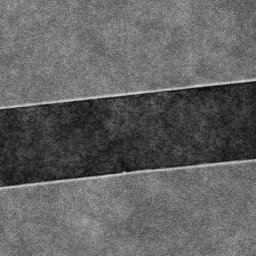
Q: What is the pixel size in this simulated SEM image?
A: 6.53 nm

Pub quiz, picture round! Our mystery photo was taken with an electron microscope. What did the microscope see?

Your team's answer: one or a few lines or trenches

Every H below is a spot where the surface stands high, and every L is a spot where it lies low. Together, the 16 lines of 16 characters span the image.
HHHHHHHHHHHHHHHH
HHHHHHHHHHHHHHHH
HHHHHHHHHHHHHHHH
HHHHHHHHHHHHHHHH
HHHHHHHHHHHHHHHH
HHHHHHHHHHHHLLLL
HHHLLLLLLLLLLLLL
LLLLLLLLLLLLLLLL
LLLLLLLLLLLLLLLL
LLLLLLLLLLLLLLLL
LLLLLLLLLLLHHHHH
LLHHHHHHHHHHHHHH
HHHHHHHHHHHHHHHH
HHHHHHHHHHHHHHHH
HHHHHHHHHHHHHHHH
HHHHHHHHHHHHHHHH